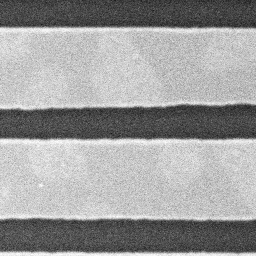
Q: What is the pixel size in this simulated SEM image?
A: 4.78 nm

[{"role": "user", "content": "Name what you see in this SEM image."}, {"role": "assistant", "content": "lines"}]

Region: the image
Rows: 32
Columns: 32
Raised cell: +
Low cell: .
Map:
................................
................................
................................
................................
++++++++++++++++++++++++++++++++
++++++++++++++++++++++++++++++++
++++++++++++++++++++++++++++++++
++++++++++++++++++++++++++++++++
++++++++++++++++++++++++++++++++
++++++++++++++++++++++++++++++++
++++++++++++++++++++++++++++++++
++++++++++++++++++++++++++++++++
++++++++++++++++++++++++++++++++
++++++..........................
................................
................................
................................
++++....+....+.+++.++++......+++
++++++++++++++++++++++++++++++++
++++++++++++++++++++++++++++++++
++++++++++++++++++++++++++++++++
++++++++++++++++++++++++++++++++
++++++++++++++++++++++++++++++++
++++++++++++++++++++++++++++++++
++++++++++++++++++++++++++++++++
++++++++++++++++++++++++++++++++
++++++++++++++++++++++++++++++++
................................
................................
................................
................................
................................